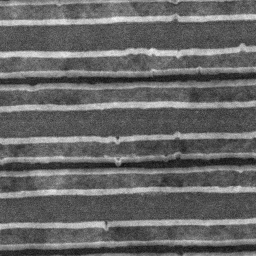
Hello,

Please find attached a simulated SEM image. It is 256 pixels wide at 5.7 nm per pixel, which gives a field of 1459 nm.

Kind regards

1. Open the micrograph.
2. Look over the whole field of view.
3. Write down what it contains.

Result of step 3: parallel lines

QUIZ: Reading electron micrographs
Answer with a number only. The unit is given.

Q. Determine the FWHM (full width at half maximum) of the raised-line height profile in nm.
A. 115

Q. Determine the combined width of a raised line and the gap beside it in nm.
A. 248